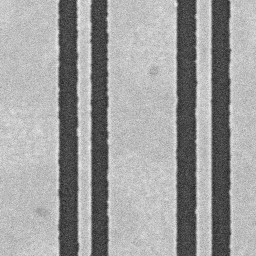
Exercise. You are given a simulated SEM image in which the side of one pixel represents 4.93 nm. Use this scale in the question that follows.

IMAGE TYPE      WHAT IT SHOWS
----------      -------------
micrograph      lines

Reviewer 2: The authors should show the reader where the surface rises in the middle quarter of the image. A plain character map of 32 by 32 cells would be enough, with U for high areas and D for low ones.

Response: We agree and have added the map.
DDDUUUDDDDDUUUUUUUUUUUUUUUUUDDDD
DDDUUUDDDDDUUUUUUUUUUUUUUUUUDDDD
DDDDUUDDDDDUUUUUUUUUUUUUUUUUDDDD
DDDDUUDDDDDUUUUUUUUUUUUUUUUUDDDD
DDDDUUDDDDDUUUUUUUUUUUUUUUUUDDDD
DDDUUUUDDDDUUUUUUUUUUUUUUUUUDDDD
DDDUUUUDDDDUUUUUUUUUUUUUUUUUDDDD
DDDUUUUDDDDUUUUUUUUUUUUUUUUUDDDD
DDDDUUDDDDDUUUUUUUUUUUUUUUUUDDDD
DDDDUUDDDDDUUUUUUUUUUUUUUUUUDDDD
DDDDUUDDDDDUUUUUUUUUUUUUUUUUDDDD
DDDDUUUDDDDUUUUUUUUUUUUUUUUUDDDD
DDDDUUDDDDDUUUUUUUUUUUUUUUUUDDDD
DDDDUUUDDDDUUUUUUUUUUUUUUUUUDDDD
DDDDUUUDDDDUUUUUUUUUUUUUUUUUDDDD
DDDDUUDDDDDUUUUUUUUUUUUUUUUUDDDD
DDDDUUDDDDDUUUUUUUUUUUUUUUUUDDDD
DDDDUUDDDDDUUUUUUUUUUUUUUUUUDDDD
DDDDUUDDDDDUUUUUUUUUUUUUUUUUDDDD
DDDDUUUDDDDUUUUUUUUUUUUUUUUUDDDD
DDDDUUUDDDDUUUUUUUUUUUUUUUUUDDDD
DDDDUUDDDDDUUUUUUUUUUUUUUUUUDDDD
DDDDUUUDDDDUUUUUUUUUUUUUUUUUDDDD
DDDDUUUDDDDUUUUUUUUUUUUUUUUUDDDD
DDDDUUUDDDDUUUUUUUUUUUUUUUUUDDDD
DDDDUUUDDDDUUUUUUUUUUUUUUUUUDDDD
DDDDUUUDDDDUUUUUUUUUUUUUUUUUDDDD
DDDDUUUDDDDUUUUUUUUUUUUUUUUUDDDD
DDDDUUDDDDDUUUUUUUUUUUUUUUUUDDDD
DDDDUUUDDDDUUUUUUUUUUUUUUUUUDDDD
DDDDUUUDDDDUUUUUUUUUUUUUUUUUDDDD
DDDDUUUDDDDUUUUUUUUUUUUUUUUUDDDD